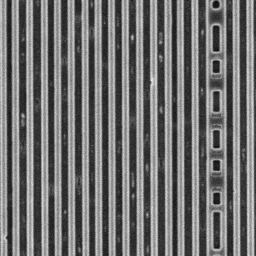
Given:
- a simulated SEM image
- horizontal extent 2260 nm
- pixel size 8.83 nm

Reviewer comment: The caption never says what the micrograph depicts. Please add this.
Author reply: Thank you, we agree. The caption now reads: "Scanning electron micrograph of parallel lines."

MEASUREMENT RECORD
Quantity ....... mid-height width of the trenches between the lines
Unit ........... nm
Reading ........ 68.4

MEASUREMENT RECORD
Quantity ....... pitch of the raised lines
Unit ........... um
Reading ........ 0.122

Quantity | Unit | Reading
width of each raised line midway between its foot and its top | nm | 53